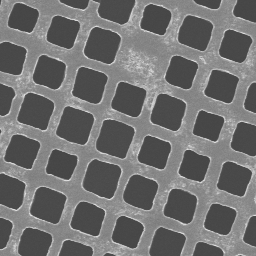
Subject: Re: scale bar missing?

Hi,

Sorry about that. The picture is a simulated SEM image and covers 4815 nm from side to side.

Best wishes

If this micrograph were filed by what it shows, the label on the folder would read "a regular array of holes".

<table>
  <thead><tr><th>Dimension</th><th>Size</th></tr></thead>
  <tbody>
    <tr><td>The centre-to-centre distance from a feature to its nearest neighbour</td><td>782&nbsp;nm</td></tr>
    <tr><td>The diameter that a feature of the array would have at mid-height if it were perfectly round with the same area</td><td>616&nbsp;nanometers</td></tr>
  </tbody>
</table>